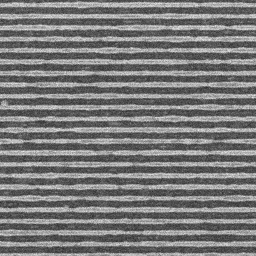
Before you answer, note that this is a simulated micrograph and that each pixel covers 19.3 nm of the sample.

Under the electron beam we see parallel lines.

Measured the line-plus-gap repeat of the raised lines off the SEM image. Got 220 nanometers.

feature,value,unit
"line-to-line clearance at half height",154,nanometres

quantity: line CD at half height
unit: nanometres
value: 57.9